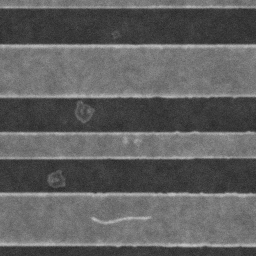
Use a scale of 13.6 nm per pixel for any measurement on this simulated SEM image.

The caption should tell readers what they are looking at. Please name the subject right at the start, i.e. lines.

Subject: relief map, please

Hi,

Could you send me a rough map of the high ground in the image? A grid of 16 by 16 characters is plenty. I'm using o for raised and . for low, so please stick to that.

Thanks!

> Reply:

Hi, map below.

................
................
................
oooooooooooooooo
oooooooooooooooo
oooooooooooooooo
................
................
oooooooooooooooo
oooooooooooooooo
................
................
oooooooooooooooo
oooooooooooooooo
oooooooooooooooo
................